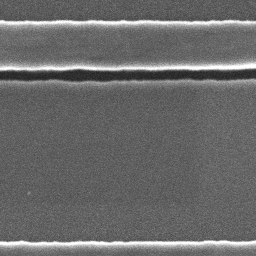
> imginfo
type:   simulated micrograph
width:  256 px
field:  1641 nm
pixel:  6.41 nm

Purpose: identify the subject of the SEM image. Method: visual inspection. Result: lines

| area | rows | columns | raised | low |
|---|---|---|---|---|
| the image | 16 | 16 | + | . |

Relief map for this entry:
................
++++++++++++++++
++++++++++++++++
++++++++++++++++
................
................
................
................
................
................
................
................
................
................
................
++++++++++++++++